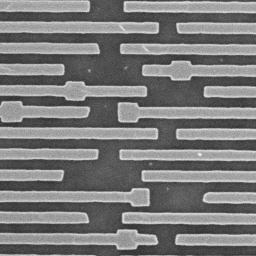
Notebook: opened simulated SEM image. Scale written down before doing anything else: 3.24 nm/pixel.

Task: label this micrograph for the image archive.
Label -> wiring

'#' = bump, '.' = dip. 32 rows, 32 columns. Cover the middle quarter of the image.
....................############
....................############
....................############
...........................#####
.#..............................
######..........................
#####################...........
#####################...........
#####...........................
................................
..............####..............
######........##################
######........##################
..............#####......#######
................................
................................
#######################.....####
#######################.....####
#.##..#################.....####
................................
................................
########......#.................
########......##################
########......##################
................................
................................
................................
....................############
....................############
................................
................................
.................####...........